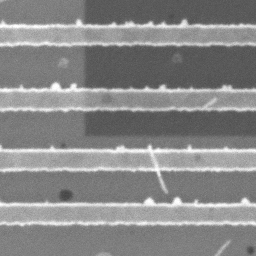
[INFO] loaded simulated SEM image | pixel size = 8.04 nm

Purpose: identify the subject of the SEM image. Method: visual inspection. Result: lines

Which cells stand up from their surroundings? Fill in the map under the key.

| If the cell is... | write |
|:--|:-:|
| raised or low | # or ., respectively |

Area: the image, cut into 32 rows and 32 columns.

................................
................................
................................
################################
################################
################################
................................
................................
................................
................................
................................
################################
################################
################################
................................
................................
................................
................................
................................
################################
################################
................................
................................
................................
................................
..................#..##.#.....#.
################################
################################
................................
................................
................................
................................